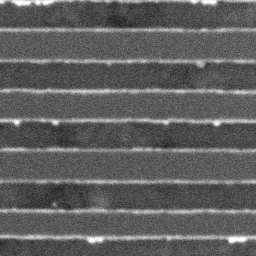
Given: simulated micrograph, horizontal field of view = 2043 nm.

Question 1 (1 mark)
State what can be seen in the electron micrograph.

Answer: lines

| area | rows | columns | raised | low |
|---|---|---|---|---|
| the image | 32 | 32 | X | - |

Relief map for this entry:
--------------------------------
--------------------------------
--------------------------------
--------------------------------
XXXXXXXXXXXXXXXXXXXXXXXXXXXXXXXX
XXXXXXXXXXXXXXXXXXXXXXXXXXXXXXXX
XXXXXXXXXXXXXXXXXXXXXXXXXXXXXXXX
XXXXXXXXXXXXXXXXXXXXXXXXXXXXXXXX
--------------------------------
--------------------------------
--------------------------------
XXXXXXXXXXXXXXXXXXXXXXXXXXXXXXXX
XXXXXXXXXXXXXXXXXXXXXXXXXXXXXXXX
XXXXXXXXXXXXXXXXXXXXXXXXXXXXXXXX
XXXXXXXXXXXXXXXXXXXXXXXXXXXXXXXX
--------------------------------
--------------------------------
--------------------------------
--------------------------------
XXXXXXXXXXXXXXXXXXXXXXXXXXXXXXXX
XXXXXXXXXXXXXXXXXXXXXXXXXXXXXXXX
XXXXXXXXXXXXXXXXXXXXXXXXXXXXXXXX
XXXXXXXXXXXXXXXXXXXXXXXXXXXXXXXX
--------------------------------
--------------------------------
--------------------------------
XXXXXXXXXXXXXXXXXXXXXXXXXXXXXXXX
XXXXXXXXXXXXXXXXXXXXXXXXXXXXXXXX
XXXXXXXXXXXXXXXXXXXXXXXXXXXXXXXX
XXXXXXXXXXXXXXXXXXXXXXXXXXXXXXXX
--------------------------------
--------------------------------